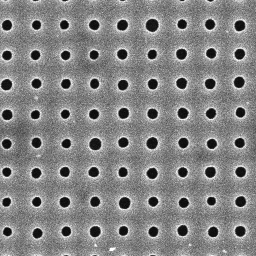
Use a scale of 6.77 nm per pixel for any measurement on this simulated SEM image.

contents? a regular array of holes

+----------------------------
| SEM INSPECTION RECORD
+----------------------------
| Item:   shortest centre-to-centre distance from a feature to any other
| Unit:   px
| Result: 28.3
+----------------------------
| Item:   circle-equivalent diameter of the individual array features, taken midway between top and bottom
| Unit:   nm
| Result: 70.4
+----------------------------